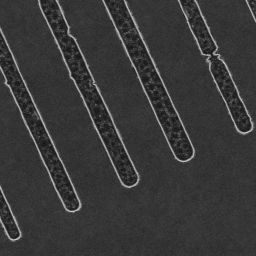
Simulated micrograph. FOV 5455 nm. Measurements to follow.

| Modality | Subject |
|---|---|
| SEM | one or a few lines or trenches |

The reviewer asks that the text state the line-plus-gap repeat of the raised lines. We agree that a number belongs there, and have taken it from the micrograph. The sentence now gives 1340 nanometres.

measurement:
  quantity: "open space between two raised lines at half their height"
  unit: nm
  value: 977